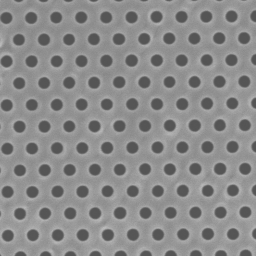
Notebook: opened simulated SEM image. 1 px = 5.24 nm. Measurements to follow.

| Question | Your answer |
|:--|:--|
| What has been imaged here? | a regular array of holes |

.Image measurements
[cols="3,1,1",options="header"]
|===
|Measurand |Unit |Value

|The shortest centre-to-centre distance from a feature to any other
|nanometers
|130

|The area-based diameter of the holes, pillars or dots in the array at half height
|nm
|62.6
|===